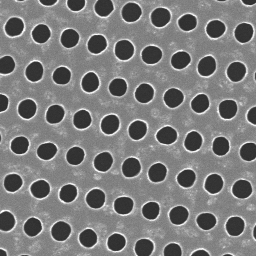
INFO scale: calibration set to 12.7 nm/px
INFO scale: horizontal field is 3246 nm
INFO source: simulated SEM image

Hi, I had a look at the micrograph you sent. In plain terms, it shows a regular array of holes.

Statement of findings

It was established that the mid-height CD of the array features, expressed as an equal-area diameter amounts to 239 nm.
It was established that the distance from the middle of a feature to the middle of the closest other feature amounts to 0.354 micrometres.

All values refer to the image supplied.